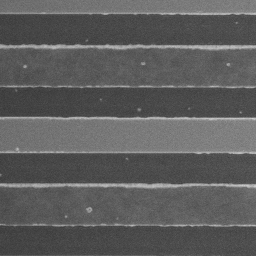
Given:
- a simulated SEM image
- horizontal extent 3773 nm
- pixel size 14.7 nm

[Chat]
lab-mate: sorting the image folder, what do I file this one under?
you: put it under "lines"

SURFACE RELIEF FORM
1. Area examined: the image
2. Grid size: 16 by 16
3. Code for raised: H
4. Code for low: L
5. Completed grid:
HHHHHHHHHHHHHHHH
LLLLLLLLLLLLLLLL
LLLLLLLLLLLLLLLL
HHHHHHHHHHHHHHHH
HHHHHHHHHHHHHHHH
LLLLLLLLLLLLLLLL
LLLLLLLLLLLLLLLL
HHHHHHHHHHHHHHHH
HHHHHHHHHHHHHHHH
HHHHHHHHHHHHHHHH
LLLLLLLLLLLLLLLL
LLLLLLLLLLLLLLLL
HHHHHHHHHHHHHHHH
HHHHHHHHHHHHHHHH
LLLLLLLLLLLLLLLL
LLLLLLLLLLLLLLLL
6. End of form